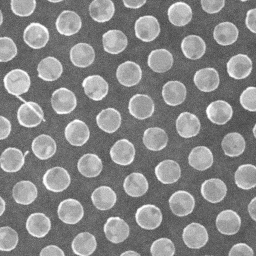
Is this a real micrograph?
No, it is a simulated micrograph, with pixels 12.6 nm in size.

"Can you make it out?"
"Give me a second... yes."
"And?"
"a regular array of raised bodies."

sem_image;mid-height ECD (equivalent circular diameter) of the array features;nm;308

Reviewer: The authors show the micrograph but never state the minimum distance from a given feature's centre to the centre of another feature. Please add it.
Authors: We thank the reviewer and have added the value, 439 nm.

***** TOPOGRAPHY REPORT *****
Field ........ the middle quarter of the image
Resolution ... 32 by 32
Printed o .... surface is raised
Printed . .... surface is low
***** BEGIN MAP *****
...ooo........ooooo..oooooo.....
.............oooooo...oooo......
.............oooooo.............
......ooo....oooooo.............
.....ooooo....oooo........ooo...
.....oooooo.....o........ooooo..
o....oooooo..............ooooo..
oo....ooooo..............ooooo..
ooo....ooo.......oooo....ooooo..
ooo.............oooooo...ooooo..
ooo.............oooooo..........
oo........ooo...oooooo..........
.........ooooo...ooooo.......ooo
........oooooo.....o.........ooo
..ooo...oooooo..............oooo
.ooooo...ooooo..............oooo
oooooo....ooo........oooo...oooo
oooooo..............ooooo....ooo
.ooooo..............oooooo......
.oooo........ooo....oooooo......
............ooooo....oooo.......
............oooooo....oo........
............oooooo..............
....ooooo...ooooo..............o
....ooooo....oooo........ooo...o
....oooooo.............oooooo...
....ooooo..............oooooo...
o....oooo........oo....oooooo...
o...............oooo....ooooo...
o..............oooooo....ooo....
o..............oooooo...........
........oooo...oooooo...........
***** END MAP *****